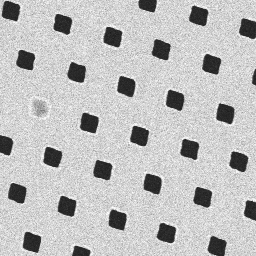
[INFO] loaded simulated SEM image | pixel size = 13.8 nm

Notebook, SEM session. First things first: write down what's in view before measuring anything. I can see a regular array of holes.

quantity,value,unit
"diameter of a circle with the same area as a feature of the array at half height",264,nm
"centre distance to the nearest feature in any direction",690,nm